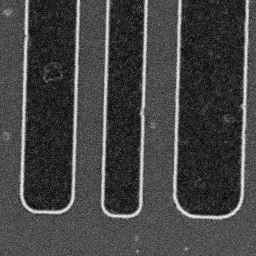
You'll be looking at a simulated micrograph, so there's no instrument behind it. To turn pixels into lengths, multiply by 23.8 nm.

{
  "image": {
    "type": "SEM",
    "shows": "one or a few lines or trenches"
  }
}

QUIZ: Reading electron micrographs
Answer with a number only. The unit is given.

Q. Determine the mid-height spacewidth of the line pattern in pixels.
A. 33.4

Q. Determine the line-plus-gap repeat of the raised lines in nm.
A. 1920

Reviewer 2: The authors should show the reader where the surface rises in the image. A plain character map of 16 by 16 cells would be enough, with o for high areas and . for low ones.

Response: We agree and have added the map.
..ooo..oo..oooo.
..ooo..oo..oooo.
..ooo..oo..oooo.
..ooo..oo..oooo.
..ooo..oo..oooo.
..ooo..oo..oooo.
..ooo..oo..oooo.
.oooo..oo..oooo.
.oooo..oo..oooo.
.oooo..oo..oooo.
.oooo.ooo..oooo.
.oooo.ooo..oooo.
.ooo..ooo..oooo.
.......o....oo..
................
................